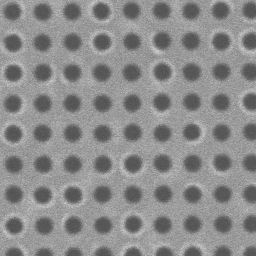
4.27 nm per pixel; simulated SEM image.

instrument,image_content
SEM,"a regular array of holes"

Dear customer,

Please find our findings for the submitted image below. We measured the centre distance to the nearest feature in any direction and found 126 nanometres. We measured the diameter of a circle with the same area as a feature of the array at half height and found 74.4 nanometers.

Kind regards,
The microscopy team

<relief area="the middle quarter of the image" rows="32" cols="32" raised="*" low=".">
*..*****...*****..*****...****..
....***.....***....***.....***..
....***.....***....***.....***..
....****...****....****...****..
********************************
********************************
********************************
************************.******.
....****...****....****...****..
....***.....***....***.....***..
....***.....***....***....****..
*...****...*****..*****...*****.
********************************
********************************
********************************
*..******..*****..******.******.
....****....***....****....***..
....***.....***....***.....***..
....****....***....****...****..
**.*********************.*******
********************************
********************************
********************************
*...****...*****...****...****..
....****....***....***.....***..
....****....***....****....***..
*...****...*****...****...*****.
********************************
********************************
********************************
*********.**************.*******
*...****....***....****....***..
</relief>